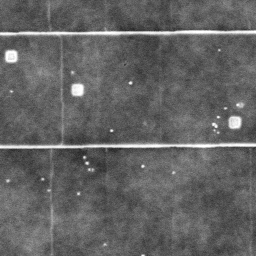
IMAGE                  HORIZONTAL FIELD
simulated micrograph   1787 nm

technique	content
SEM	wiring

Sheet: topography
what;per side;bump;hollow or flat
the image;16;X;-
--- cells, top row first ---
----------------
----------------
XXXXXXXXXXXXXXXX
XXXXXXXXXXXXXXXX
XXXXXXXXXXXXXXXX
XXXXXXXXXXXXXXXX
XXXXXXXXXXXXXXXX
XXXXXXXXXXXXXXXX
XXXXXXXXXXXXXXXX
----------------
----------------
----------------
----------------
----------------
----------------
----------------